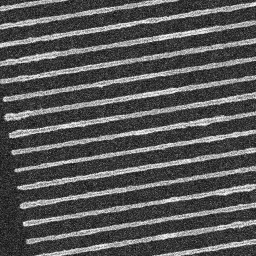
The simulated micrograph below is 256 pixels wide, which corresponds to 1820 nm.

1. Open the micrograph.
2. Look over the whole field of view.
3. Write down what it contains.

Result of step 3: parallel lines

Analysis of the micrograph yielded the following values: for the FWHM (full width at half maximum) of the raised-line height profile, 0.0316 um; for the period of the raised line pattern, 128 nm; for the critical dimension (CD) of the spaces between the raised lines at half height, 96.5 nm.